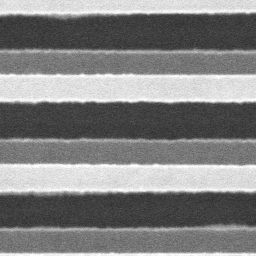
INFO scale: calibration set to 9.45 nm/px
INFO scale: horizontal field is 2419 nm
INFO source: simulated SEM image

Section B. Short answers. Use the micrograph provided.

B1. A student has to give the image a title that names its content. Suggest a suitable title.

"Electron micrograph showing lines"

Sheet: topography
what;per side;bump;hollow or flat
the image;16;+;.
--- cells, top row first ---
++++++++++++++++
................
................
++++++++++++++++
++++++++++++++++
++++++++++++++++
................
................
................
++++++++++++++++
++++++++++++++++
++++++++++++++++
................
................
++++++++++++++++
++++++++++++++++